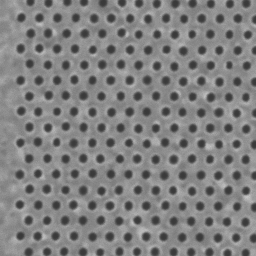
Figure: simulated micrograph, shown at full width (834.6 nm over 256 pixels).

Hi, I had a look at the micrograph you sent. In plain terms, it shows a regular array of holes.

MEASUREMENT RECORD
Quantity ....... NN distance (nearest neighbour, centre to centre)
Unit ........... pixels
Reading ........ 17.2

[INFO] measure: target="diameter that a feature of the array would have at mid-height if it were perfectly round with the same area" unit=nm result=28.7